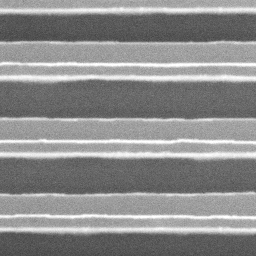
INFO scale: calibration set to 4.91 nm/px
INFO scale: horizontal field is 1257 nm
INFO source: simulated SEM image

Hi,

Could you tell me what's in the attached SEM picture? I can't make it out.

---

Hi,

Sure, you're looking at lines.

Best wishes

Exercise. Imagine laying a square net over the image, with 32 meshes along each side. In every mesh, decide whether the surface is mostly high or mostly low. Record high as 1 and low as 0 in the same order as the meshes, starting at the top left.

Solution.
11111111111111111111111111111111
00000000000000000000000000000000
00000000000000000000000000000000
00000000000000000000000000000000
00000000000000000000000000000000
11111111111111111111111111111111
11111111111111111111111111111111
11111111111111111111111111111111
11111111111111111111111111111111
11111111111111111111111111111111
00000000000000000000000000000000
00000000000000000000000000000000
00000000000000000000000000000000
00000000000000000000000000000000
00000000000000000000000000000000
11111111111111111111111111111111
11111111111111111111111111111111
11111111111111111111111111111111
11111111111111111111111111111111
00000000000000000000000000000000
00000000000000000000000000000000
00000000000000000000000000000000
00000000000000000000000000000000
00000000000000000000000000000000
11111111111111111111111111111111
11111111111111111111111111111111
11111111111111111111111111111111
11111111111111111111111111111111
11111111111111111111111111111111
00000000000000000000000000000000
00000000000000000000000000000000
00000000000000000000000000000000